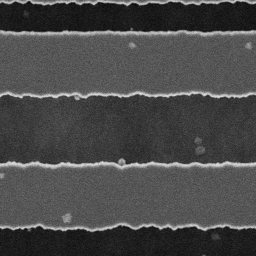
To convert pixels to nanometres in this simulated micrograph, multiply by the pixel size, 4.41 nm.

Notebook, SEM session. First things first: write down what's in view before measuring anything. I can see lines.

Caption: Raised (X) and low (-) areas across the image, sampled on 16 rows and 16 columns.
----------------
----------------
XXXXXXXXXXXXXXXX
XXXXXXXXXXXXXXXX
XXXXXXXXXXXXXXXX
XXXXXXXXXXXXXXXX
----------------
----------------
----------------
----------------
XXXXXXXXXXXXXXXX
XXXXXXXXXXXXXXXX
XXXXXXXXXXXXXXXX
XXXXXXXXXXXXXXXX
----------------
----------------